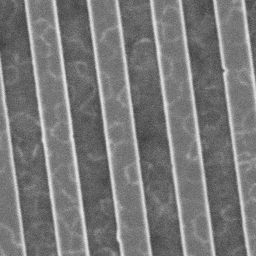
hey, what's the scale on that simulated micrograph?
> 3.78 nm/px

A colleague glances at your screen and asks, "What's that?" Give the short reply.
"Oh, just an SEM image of parallel lines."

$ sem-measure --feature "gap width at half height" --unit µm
0.122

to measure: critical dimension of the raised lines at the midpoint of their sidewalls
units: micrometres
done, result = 0.112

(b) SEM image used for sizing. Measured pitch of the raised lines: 236 nm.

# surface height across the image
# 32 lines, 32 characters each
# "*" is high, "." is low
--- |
...****....****....****....****.
...****....****....****....****.
...****....****....****....****.
....***....****....****....****.
....***.....***....****....****.
....****....***.....***....****.
....****....****....***.....***.
....****....****....****....***.
....****....****....****....****
....****....****....****....****
.....***....****....****....****
.....***.....***....****....****
*....***.....***....****....****
*....****....***.....***.....***
*....****....****....****....***
*....****....****....****....***
*....****....****....****....***
*....****....****....****....***
*.....***....****....****....***
**....***.....***....****....***
**....****....***.....***....***
**....****....****....***.....**
**....****....****....****....**
**....****....****....****....**
**....****....****....****....**
**.....***....****....****....**
**.....***.....***....****....**
***....****....***....****....**
***....****....***.....***....**
***....****....****....****....*
***....****....****....****....*
***....****....****....****....*